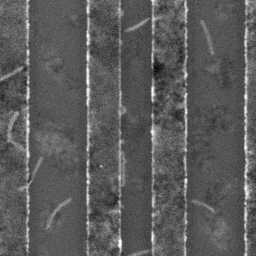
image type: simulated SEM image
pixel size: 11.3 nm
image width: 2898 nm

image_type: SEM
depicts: lines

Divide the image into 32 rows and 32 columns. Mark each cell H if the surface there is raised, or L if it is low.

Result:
HHHLLLLLLLLHHHHLLLLHHHHLLLLLLLLH
HHHLLLLLLLLHHHHLLLLHHHHLLLLLLLLH
HHHLLLLLLLLHHHHLLLLHHHHLLLLLLLLH
HHHLLLLLLLLHHHHLLLLHHHHLLLLLLLLH
HHHLLLLLLLLHHHHLLLLHHHHLLLLLLLLH
HHHLLLLLLLLHHHHLLLLHHHHLLLLLLLLH
HHHLLLLLLLLHHHHLLLLHHHHLLLLLLLLH
HHHLLLLLLLLHHHHLLLLHHHHLLLLLLLLH
HHHLLLLLLLLHHHHLLLLHHHHLLLLLLLLH
HHHLLLLLLLLHHHHLLLLHHHHLLLLLLLLH
HHHLLLLLLLLHHHHLLLLHHHHLLLLLLLLH
HHHLLLLLLLLHHHHLLLLHHHHLLLLLLLLH
HHHLLLLLLLLHHHHLLLLHHHHLLLLLLLLH
HHHHLLLLLLLHHHHLLLLHHHHLLLLLLLLH
HHHLLLLLLLLHHHHLLLLHHHHLLLLLLLLH
HHHLLLLLLLLHHHHLLLLHHHHLLLLLLLLH
HHHLLLLLLLLHHHHLLLLHHHHLLLLLLLLH
HHHLLLLLLLLHHHHLLLLHHHHLLLLLLLLH
HHHLLLLLLLLHHHHLLLLHHHHLLLLLLLLH
HHHLLLLLLLLHHHHLLLLHHHHLLLLLLLLH
HHHLLLLLLLLHHHHLLLLHHHHLLLLLLLLH
HHHLLLLLLLLHHHHLLLLHHHHLLLLLLLLH
HHHHLLLLLLLHHHHLLLLHHHHLLLLLLLLH
HHHHLLLLLLLHHHHLLLLHHHHLLLLLLLLH
HHHLLLLLLLLHHHHLLLLHHHHLLLLLLLLH
HHHLLLLLLLLHHHHLLLLHHHHLLLLLLLLH
HHHLLLLLLLLHHHHLLLLHHHHLLLLLLLLH
HHHLLLLLLLLHHHHLLLLHHHHLLLLLLLLH
HHHLLLLLLLLHHHHLLLLHHHHLLLLLLLLH
HHHLLLLLLLLHHHHLLLLHHHHLLLLLLLLH
HHHHLLLLLLLHHHHLLLLHHHHLLLLLLLLH
HHHLLLLLLLLHHHHLLLLHHHHLLLLLLLLH